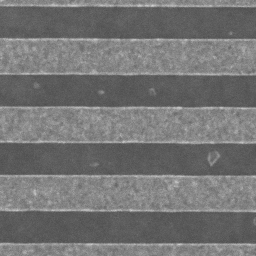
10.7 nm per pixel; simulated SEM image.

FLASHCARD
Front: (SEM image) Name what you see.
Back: wiring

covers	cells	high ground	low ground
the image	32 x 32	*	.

********************************
................................
................................
................................
................................
********************************
********************************
********************************
********************************
................................
................................
................................
................................
***********.....***.............
********************************
********************************
********************************
********************************
................................
................................
................................
................................
********************************
********************************
********************************
********************************
................................
................................
................................
................................
................................
********************************